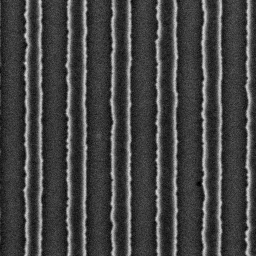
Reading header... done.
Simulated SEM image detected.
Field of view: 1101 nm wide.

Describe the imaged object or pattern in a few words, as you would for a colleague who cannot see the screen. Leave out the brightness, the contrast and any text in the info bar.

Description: lines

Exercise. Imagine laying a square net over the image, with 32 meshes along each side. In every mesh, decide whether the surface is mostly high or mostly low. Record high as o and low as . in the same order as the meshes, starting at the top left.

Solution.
...oo....oo...oo....oo...ooo...o
...oo....oo...oo....oo...ooo...o
...oo....oo...oo....oo...ooo...o
...oo....oo...oo....oo...ooo...o
...oo....oo...oo....oo...ooo...o
...oo....oo...oo....oo...ooo...o
...oo....oo...oo....oo...ooo...o
...oo...ooo...oo....oo...ooo...o
...oo...ooo...oo....oo...ooo...o
...oo....oo...oo....oo....oo...o
...oo....oo...oo....oo...ooo...o
...oo....oo...oo....oo...ooo...o
...oo....oo...oo....oo...ooo...o
...oo...ooo...oo....oo...ooo...o
...oo....oo...oo....oo...ooo...o
...oo....oo...oo....oo...ooo...o
...oo....oo...oo....oo...ooo...o
...oo....oo...oo....oo...ooo...o
...oo....oo...oo....oo...ooo...o
...oo...ooo...oo....oo...ooo...o
...oo....oo...oo....oo...ooo...o
...oo....oo...oo....oo...ooo...o
...oo....oo...oo....oo...ooo...o
...oo....oo...oo....oo...ooo...o
...oo....oo...oo....oo....oo...o
...oo....oo...oo....oo...ooo...o
...oo...ooo...oo....oo...ooo...o
...oo...ooo...oo....oo...ooo...o
...oo....oo...oo....oo...ooo...o
...oo....oo...oo....oo...ooo...o
...oo....oo...oo....oo...ooo...o
...oo....oo...oo....oo...ooo...o